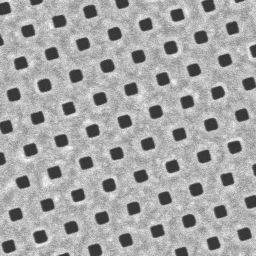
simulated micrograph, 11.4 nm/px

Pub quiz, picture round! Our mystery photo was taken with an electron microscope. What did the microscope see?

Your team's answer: a regular array of holes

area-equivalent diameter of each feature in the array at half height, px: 14.3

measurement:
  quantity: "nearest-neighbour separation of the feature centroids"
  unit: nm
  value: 371